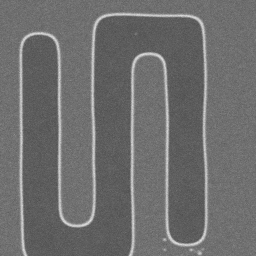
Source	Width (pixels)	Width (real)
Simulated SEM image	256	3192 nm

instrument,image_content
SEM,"groups of lines, slits or small figures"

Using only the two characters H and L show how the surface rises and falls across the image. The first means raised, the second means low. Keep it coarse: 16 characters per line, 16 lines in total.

HHHHHHHHHHHHHHHH
HHHHHHLLLLLLHHHH
HHLHHHLLLLLLLHHH
HLLLHHLLLHLLLHHH
HLLLHHLLHHLLLHHH
HLLLHHLLHHLLLHHH
HLLLHHLLHHLLLHHH
HLLLHHLLHHLLLHHH
HLLLHHLLHHLLLHHH
HLLLHHLLHHLLLHHH
HLLLHHLLHHLLLHHH
HLLLHHLLHHLLLHHH
HLLLHHLLHHLLLHHH
HLLLHHLLHHLLLHHH
HLLLLLLLHHHLLHHH
HHLLLLLLHHHHHHHH